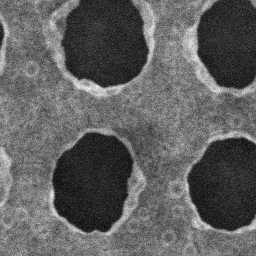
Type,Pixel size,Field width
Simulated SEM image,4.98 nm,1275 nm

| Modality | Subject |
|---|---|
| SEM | holes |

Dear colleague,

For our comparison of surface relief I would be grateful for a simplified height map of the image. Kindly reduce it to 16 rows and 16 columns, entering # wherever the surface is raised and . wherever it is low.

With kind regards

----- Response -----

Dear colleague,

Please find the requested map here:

####.....####...
####......##....
####.....###....
####.....###....
####.....####...
##############.#
################
################
#####..#########
####....#####...
###.....####....
###.....####....
###.....####....
####....####....
#####.##########
################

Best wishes